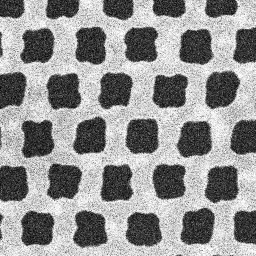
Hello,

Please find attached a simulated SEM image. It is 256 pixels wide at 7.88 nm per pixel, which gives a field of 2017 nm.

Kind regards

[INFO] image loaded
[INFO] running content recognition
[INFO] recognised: a regular array of holes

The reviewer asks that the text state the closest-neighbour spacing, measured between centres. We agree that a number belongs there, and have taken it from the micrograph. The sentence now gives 399 nanometres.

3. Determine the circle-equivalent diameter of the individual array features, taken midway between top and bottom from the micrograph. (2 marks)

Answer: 285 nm